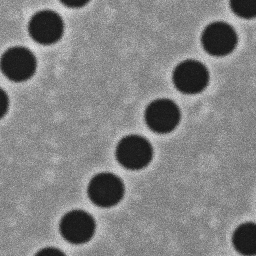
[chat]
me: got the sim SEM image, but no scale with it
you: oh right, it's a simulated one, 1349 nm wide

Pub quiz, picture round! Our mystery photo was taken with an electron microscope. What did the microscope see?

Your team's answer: holes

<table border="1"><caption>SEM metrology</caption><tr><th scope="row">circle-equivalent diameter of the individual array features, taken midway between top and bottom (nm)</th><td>196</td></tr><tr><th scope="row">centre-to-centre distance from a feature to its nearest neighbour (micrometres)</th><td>0.246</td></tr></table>